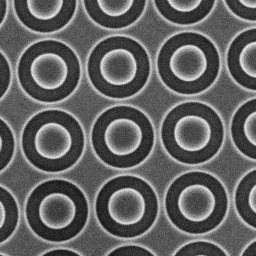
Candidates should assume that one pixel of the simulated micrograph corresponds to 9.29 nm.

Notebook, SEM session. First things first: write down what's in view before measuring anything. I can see an array of small figures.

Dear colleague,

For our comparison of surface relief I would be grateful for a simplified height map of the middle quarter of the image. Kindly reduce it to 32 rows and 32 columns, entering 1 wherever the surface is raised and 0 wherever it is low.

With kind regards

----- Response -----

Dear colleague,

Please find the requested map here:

00001100011111111100001000011111
10001100011111111100001000011111
10001100001111111100011100001111
00001100001111111000011100000111
00001110000111110000011110000000
00011110000000000000111111000000
00011111000000000001111111100000
00111111100000000011111111111000
01111111111100001111111111111111
11111111111111111111111111111110
11111111111110001111111111110000
11111111111000000001111111100000
01111111100000000000111111000000
00011111000000000000011110000011
00001111000011111000001110000111
00001110000111111100001100001111
00000110000111111110001100001111
10000110001111111110000100001111
11000110001111111110000100001111
11000110000111111110000110001111
11000110000111111110001110000111
10000110000011111100001110000000
00001111000000100000011111000000
00001111100000000000011111100000
00011111110000000001111111111000
00111111111000000011111111111111
11111111111111111111111111111111
11111111111111111111111111111100
11111111111100000001111111110000
00111111111000000000011111100000
00011111110000000000001111000000
00001111100000111000001111000011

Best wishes